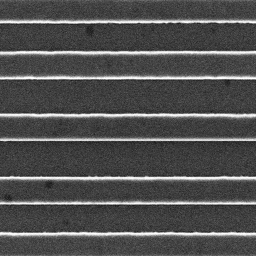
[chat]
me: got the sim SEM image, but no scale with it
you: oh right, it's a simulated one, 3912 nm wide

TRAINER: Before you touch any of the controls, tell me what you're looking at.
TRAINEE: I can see lines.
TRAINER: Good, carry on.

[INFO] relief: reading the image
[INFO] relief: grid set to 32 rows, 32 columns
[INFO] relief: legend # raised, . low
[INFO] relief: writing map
################################
################################
################################
................................
................................
................................
................................
################################
################################
################################
................................
................................
................................
................................
################################
################################
################################
################################
................................
................................
................................
................................
################################
################################
################################
................................
................................
................................
................................
################################
################################
################################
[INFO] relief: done